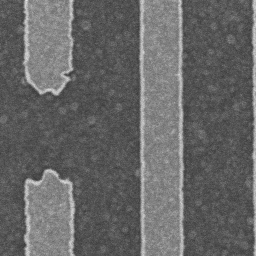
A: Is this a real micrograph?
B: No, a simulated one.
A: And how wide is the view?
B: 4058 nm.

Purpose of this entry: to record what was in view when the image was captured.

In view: one or a few lines or trenches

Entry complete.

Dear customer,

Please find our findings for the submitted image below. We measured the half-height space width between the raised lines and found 1.15 um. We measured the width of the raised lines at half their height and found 627 nm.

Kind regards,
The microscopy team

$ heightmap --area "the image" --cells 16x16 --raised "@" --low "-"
--@@-----@@-----
--@@-----@@-----
--@@-----@@-----
--@@-----@@-----
--@@-----@@-----
--@@-----@@-----
---------@@-----
---------@@-----
---------@@-----
---------@@-----
---------@@-----
--@@-----@@-----
--@@-----@@-----
--@@@----@@-----
--@@@----@@-----
--@@-----@@-----